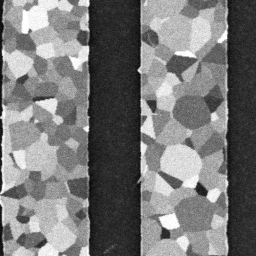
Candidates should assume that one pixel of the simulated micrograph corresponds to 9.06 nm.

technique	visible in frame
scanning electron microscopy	one or a few lines or trenches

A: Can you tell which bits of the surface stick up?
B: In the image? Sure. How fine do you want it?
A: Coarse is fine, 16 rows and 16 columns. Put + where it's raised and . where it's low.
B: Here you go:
++++++...+++++..
++++++...+++++..
++++++...+++++..
++++++...+++++..
++++++...+++++..
++++++...+++++..
+++++....+++++..
++++++...+++++..
++++++...+++++..
+++++....+++++..
+++++....+++++..
++++++...+++++..
++++++...+++++..
++++++...+++++..
++++++...+++++..
++++++...+++++..